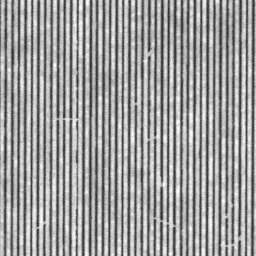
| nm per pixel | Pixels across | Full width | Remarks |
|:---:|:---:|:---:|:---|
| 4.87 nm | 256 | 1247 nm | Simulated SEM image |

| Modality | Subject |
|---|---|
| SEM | parallel lines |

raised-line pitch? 6.51 px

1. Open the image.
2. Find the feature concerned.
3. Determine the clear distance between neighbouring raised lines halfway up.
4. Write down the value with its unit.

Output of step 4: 0.0122 micrometres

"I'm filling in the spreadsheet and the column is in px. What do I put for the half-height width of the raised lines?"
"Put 4.25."